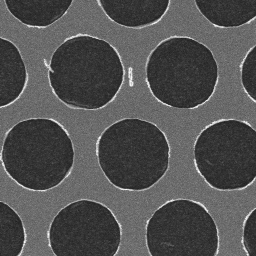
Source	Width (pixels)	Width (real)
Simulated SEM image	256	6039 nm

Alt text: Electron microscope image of holes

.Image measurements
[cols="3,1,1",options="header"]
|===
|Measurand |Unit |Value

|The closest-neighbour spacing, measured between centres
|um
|2.23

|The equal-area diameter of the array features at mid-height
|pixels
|71.3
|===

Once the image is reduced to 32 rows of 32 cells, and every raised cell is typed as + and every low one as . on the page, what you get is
+........++++........++++.......
+.......+++++........++++.......
++.....+++++++......++++++.....+
++++++++++++++++++++++++++++++++
++++++++++.+++++++++++++++++++++
..++++++......++++++.....+++++++
..+++++.......+++++.......+++++.
...+++.........++++........++++.
...+++.........+++.........+++..
...+++.........+++.........+++..
...+++.........++++........+++..
...++++........++++........++++.
..++++++......++++++......++++++
++++++++++..++++++++++..++++++++
++++++++++++++++++++++++++++++++
++.....+++++++.....++++++++....+
+.......+++++.......+++++.......
+........+++.........++++.......
.........+++.........+++........
.........+++.........+++........
+........+++.........++++.......
+........++++........++++.......
++......++++++......++++++......
+++...+++++++++...+++++++++...++
++++++++++++++++++++++++++++++++
.++++++++...+++++++++....+++++++
..+++++.......+++++.......++++++
...++++.......+++++........++++.
...+++.........+++.........++++.
...+++.........+++.........+++..
...+++.........+++.........+++..
...++++........++++........++++.